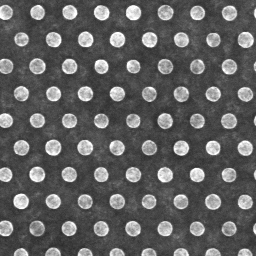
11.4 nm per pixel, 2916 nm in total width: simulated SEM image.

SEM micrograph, a regular array of raised bodies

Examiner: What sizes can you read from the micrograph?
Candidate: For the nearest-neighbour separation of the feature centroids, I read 0.354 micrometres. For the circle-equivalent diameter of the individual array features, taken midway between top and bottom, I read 170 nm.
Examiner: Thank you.